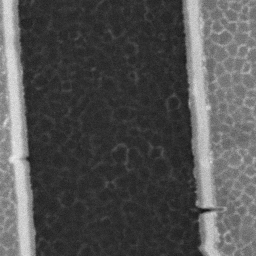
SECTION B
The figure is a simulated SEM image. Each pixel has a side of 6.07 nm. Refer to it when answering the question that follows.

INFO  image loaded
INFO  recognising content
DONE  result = one or a few lines or trenches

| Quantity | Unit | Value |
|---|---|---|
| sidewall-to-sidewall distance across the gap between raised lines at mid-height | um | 1.13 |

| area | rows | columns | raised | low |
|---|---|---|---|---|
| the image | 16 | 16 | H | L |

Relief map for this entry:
LLLLLLLLLLLLHHHH
HLLLLLLLLLLLHHHH
HLLLLLLLLLLLHHHH
HLLLLLLLLLLLHHHH
HLLLLLLLLLLLHHHH
HLLLLLLLLLLLHHHH
HLLLLLLLLLLLLHHH
HLLLLLLLLLLLLHHH
HLLLLLLLLLLLLHHH
HLLLLLLLLLLLLHHH
HLLLLLLLLLLLLHHH
HLLLLLLLLLLLLHHH
HLLLLLLLLLLLLHHH
HLLLLLLLLLLLLHHH
HLLLLLLLLLLLLHHH
HHLLLLLLLLLLLHHH